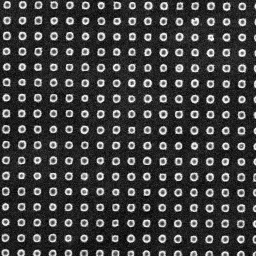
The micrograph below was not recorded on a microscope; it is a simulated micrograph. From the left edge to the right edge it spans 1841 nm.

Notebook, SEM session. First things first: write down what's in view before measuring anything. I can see a regular array of raised bodies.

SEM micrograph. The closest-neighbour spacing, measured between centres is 109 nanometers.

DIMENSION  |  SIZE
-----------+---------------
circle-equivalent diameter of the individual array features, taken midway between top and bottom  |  51.6 nanometers